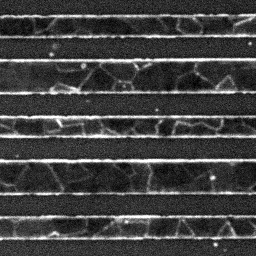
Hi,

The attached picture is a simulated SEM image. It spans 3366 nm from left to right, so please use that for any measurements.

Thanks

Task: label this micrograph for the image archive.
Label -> lines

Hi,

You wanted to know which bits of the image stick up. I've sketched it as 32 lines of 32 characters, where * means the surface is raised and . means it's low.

................................
................................
********************************
********************************
********************************
................................
................................
........................********
********************************
********************************
********************************
*****************************.**
................................
................................
................................
********************************
********************************
................................
................................
................................
********************************
********************************
********************************
********************************
................................
................................
................................
********************************
********************************
********************************
................................
................................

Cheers